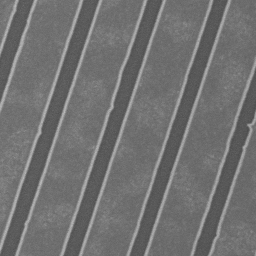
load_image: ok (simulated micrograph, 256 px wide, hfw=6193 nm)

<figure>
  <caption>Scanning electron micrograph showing one or a few lines or trenches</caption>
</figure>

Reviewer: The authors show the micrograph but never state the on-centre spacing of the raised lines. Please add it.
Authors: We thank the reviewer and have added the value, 1.49 microns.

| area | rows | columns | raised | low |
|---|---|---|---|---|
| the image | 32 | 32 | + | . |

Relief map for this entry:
++..++++++..++++++..++++++...+++
++..++++++..++++++..++++++..++++
+...+++++...+++++...++++++..++++
+..++++++..++++++..++++++...++++
+..++++++..++++++..++++++..+++++
...+++++...+++++...++++++..+++++
..++++++..++++++..++++++...+++++
..++++++..++++++..++++++..++++++
..+++++...+++++...++++++..++++++
.++++++..++++++..++++++...+++++.
.++++++..++++++..++++++..++++++.
.+++++...+++++...++++++..++++++.
++++++..++++++..++++++...+++++..
++++++..++++++..++++++..++++++..
+++++...+++++...++++++..++++++..
+++++..++++++..++++++...+++++..+
+++++..++++++..++++++..++++++..+
+++++..++++++..++++++..++++++..+
++++..++++++..++++++...+++++...+
++++..++++++..++++++..++++++..++
++++..+++++...++++++..++++++..++
+++...+++++...+++++...+++++...++
+++..++++++..++++++..++++++..+++
++...+++++...++++++..++++++..+++
++...+++++...+++++...+++++...+++
++..++++++..++++++..++++++..++++
++..++++++..++++++..++++++..++++
+..++++++...+++++...+++++...++++
+..++++++..++++++..++++++..+++++
+..+++++...++++++..++++++..+++++
...+++++...+++++...+++++...+++++
..++++++..++++++..++++++..++++++